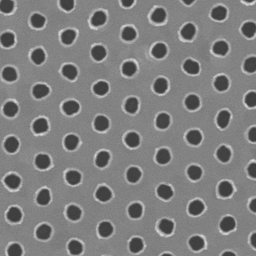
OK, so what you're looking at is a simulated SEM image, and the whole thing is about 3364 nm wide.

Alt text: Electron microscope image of a regular array of holes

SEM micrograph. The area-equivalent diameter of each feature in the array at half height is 16.3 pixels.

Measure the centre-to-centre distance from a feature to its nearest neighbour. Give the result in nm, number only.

452